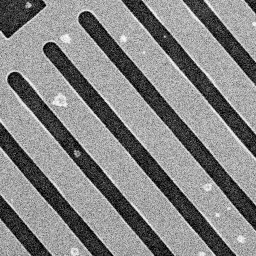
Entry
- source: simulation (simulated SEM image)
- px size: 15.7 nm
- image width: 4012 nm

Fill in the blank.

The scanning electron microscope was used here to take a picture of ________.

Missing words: groups of lines, slits or small figures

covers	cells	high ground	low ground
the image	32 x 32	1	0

00000011111111100011111000111110
00000111110111110001111100011111
00001111110011111000111110001111
00011111110001111100011111001111
10111111111000111110001111100111
11111101111100011111001111100011
11111000111110001111100111110001
11111100011111001111100011111000
11111110001111100111110001111100
10011111001111100011111000111110
10001111100111110001111100011111
11000111100011111000111110001111
11100111110001111100011111001111
11100011111000111110001111100111
11110001111100011111001111100011
11111000111110001111100111110001
01111100011111001111100011111000
00111110001111100111110001111100
00011111001111100011111000111110
10001111100111110001111100011111
11000111100011111000111110001111
11100111110001111100011111001111
11100011111000111110001111100111
11110001111100011111001111100011
11111000111110001111100111110001
01111100011111001111100011111000
00111110001111100111110001111100
00011111001111100011111000111110
10001111100111110001111100011111
11000111100011111000111110001111
11100111110001111100011111001111
11100011111000111110011111100111